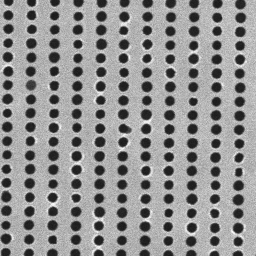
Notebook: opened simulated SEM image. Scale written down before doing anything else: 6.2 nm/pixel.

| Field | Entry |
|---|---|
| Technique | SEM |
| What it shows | a regular array of holes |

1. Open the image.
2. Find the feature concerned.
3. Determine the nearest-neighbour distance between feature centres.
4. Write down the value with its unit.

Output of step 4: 84.9 nm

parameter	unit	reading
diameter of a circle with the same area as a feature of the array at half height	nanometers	63.3